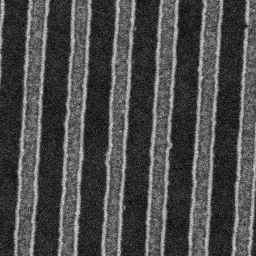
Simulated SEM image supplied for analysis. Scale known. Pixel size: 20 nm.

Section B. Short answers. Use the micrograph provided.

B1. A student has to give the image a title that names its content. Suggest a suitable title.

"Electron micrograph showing parallel lines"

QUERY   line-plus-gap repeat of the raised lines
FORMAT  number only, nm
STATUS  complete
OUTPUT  871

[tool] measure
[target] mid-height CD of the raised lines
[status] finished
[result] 16.2 px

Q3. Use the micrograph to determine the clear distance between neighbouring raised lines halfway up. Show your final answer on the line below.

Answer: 540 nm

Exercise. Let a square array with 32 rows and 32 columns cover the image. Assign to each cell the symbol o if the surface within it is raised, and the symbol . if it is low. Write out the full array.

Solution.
....oo...oo....oo...oo....oo...o
....oo...oo....oo...oo...ooo...o
....oo...oo....oo...oo...ooo...o
....oo...oo....o....oo...oo....o
...ooo...oo...oo....oo...oo....o
...ooo...oo...oo....oo...oo....o
...oo....oo...oo....oo...oo....o
...oo....oo...oo....oo...oo....o
...oo....oo...oo....oo...oo...oo
...oo....oo...oo....oo...oo...oo
...oo....oo...oo....oo...oo...oo
...oo....oo...oo...oo....oo...oo
...oo...ooo...oo...oo....oo...oo
...oo...oo....oo...oo....oo...oo
...oo...oo....oo...oo....oo...oo
...oo...oo....oo...oo....oo...oo
...oo...oo....oo...oo....oo...oo
...oo...oo....oo...oo....oo...oo
...oo...oo....oo...oo...oo....oo
...oo...oo...ooo...oo...oo....oo
..ooo...oo...ooo...oo...oo....oo
..ooo...oo...oo....oo...oo....oo
..ooo...oo....o....oo...oo....oo
..ooo...oo...oo....oo...oo....oo
..ooo...oo...oo....oo...oo....oo
..oo....oo...oo....oo...oo....oo
..oo....oo...oo....oo...oo....oo
..oo....oo...oo....oo...oo....oo
..oo....oo...oo...ooo...oo...oo.
..oo....oo...oo...oo....oo...oo.
..oo....o....oo...oo....oo...oo.
..oo...ooo...oo...oo....oo...oo.